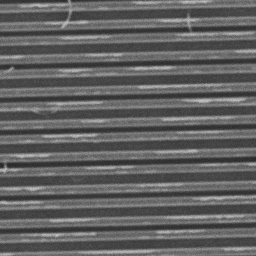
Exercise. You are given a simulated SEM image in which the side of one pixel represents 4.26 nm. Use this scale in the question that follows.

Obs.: parallel lines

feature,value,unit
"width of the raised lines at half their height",33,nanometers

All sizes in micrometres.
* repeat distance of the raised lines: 0.0698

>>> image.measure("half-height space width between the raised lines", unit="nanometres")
44.2